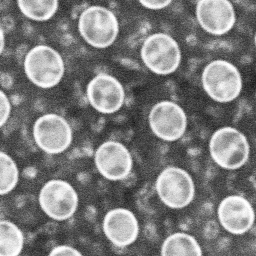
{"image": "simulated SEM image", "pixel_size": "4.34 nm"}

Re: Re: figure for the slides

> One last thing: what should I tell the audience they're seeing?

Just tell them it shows a regular array of raised bodies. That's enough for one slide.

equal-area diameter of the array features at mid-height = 0.155 um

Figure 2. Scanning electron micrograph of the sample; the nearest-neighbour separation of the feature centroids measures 289 nanometres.